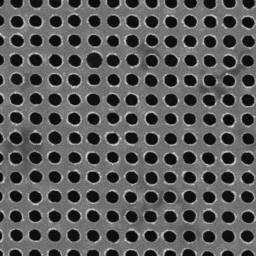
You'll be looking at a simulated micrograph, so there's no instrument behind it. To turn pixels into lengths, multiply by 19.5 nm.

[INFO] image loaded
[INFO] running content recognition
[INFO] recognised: a regular array of holes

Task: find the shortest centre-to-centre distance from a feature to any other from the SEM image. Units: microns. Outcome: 0.37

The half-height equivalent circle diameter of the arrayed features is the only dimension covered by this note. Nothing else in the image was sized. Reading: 244 nm